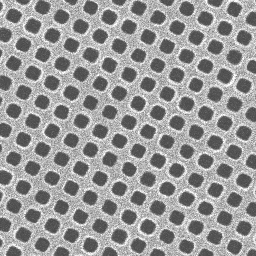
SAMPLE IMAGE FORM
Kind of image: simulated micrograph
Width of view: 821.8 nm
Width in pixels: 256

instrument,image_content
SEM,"a regular array of holes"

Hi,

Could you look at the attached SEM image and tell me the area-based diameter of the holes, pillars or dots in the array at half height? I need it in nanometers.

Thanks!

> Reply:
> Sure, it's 46.5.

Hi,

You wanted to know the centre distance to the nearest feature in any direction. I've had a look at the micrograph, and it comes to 67.6 nm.